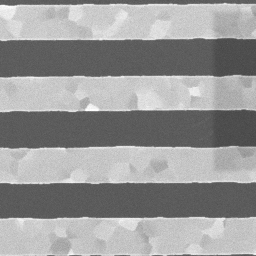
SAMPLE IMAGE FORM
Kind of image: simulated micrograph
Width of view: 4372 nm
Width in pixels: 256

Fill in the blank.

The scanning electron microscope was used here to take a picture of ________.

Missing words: wiring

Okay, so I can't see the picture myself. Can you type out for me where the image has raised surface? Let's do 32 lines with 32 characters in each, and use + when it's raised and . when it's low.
................................
++++++++++++++++++++++++++++++++
++++++++++++++++++++++++++++++++
++++++++++++++++++++++++++++++++
++++++++++++++++++++++++++++++++
................................
................................
................................
................................
................................
++++++++++++++++++++++++++++++++
++++++++++++++++++++++++++++++++
++++++++++++++++++++++++++++++++
++++++++++++++++++++++++++++++++
................................
................................
................................
................................
.............+++++++........++++
++++++++++++++++++++++++++++++++
++++++++++++++++++++++++++++++++
++++++++++++++++++++++++++++++++
++++++++++++++++++++++++++++++++
................................
................................
................................
................................
++++++++++++++++++++++++++++++++
++++++++++++++++++++++++++++++++
++++++++++++++++++++++++++++++++
++++++++++++++++++++++++++++++++
++++++++++++++++++++++++++++++++